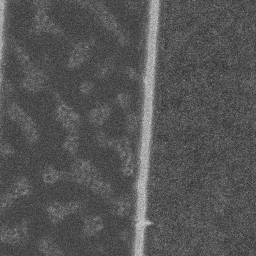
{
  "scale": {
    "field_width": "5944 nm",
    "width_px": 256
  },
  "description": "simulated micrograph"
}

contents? one or a few lines or trenches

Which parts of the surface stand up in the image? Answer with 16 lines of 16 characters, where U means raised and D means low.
UUUUUUUUUUDDDDDD
UUUUUUUUUUDDDDDD
UUUUUUUUUUDDDDDD
UUUUUUUUUDDDDDDD
UUUUUUUUUDDDDDDD
UUUUUUUUUDDDDDDD
UUUUUUUUUDDDDDDD
UUUUUUUUUDDDDDDD
UUUUUUUUUDDDDDDD
UUUUUUUUUDDDDDDD
UUUUUUUUUDDDDDDD
UUUUUUUUUDDDDDDD
UUUUUUUUUDDDDDDD
UUUUUUUUUDDDDDDD
UUUUUUUUUDDDDDDD
UUUUUUUUUDDDDDDD